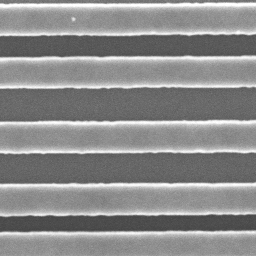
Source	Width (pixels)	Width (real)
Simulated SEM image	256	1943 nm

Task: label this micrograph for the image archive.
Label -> lines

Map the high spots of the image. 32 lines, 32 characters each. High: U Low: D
DDDDDDDDDDDDDDDDDDDDDDDDDUUUUUUU
UUUUUUUUUUUUUUUUUUUUUUUUUUUUUUUU
UUUUUUUUUUUUUUUUUUUUUUUUUUUUUUUU
UUUUUUUUUUUUUUUUUUUUUUUUUUUUUUUU
DDDDDDDDDDDDDDDDDDDDDDDDDDDDDDDD
DDDDDDDDDDDDDDDDDDDDDDDDDDDDDDDD
DDDDDDDDDDDDDDDDDDDDDDDDDDDDDDDD
UUUUUUUUUUUUUUUUUUUUUUUUUUUUUUUU
UUUUUUUUUUUUUUUUUUUUUUUUUUUUUUUU
UUUUUUUUUUUUUUUUUUUUUUUUUUUUUUUU
UUUUUUUUUUUUUUUUUUUUUUUUUUUUUUUU
DDDDDDDDDDDDDDDDDDDDDDDDDDDDDDDD
DDDDDDDDDDDDDDDDDDDDDDDDDDDDDDDD
DDDDDDDDDDDDDDDDDDDDDDDDDDDDDDDD
DDDDDDDDDDDDDDDDDDDDDDDDDDDDDDDD
UUUUUUUUUUUUUUUUUUUUUUUUUUUUUUUU
UUUUUUUUUUUUUUUUUUUUUUUUUUUUUUUU
UUUUUUUUUUUUUUUUUUUUUUUUUUUUUUUU
UUUUUUUUUUUUUUUUUUUUUUUUUUUUUUUU
DDDDDDDDDDDDDDDDDDDDDDDDDDDDDDDD
DDDDDDDDDDDDDDDDDDDDDDDDDDDDDDDD
DDDDDDDDDDDDDDDDDDDDDDDDDDDDDDDD
DDDDDDDDDDDDDDDDDDDDDDDDDDDDDDDD
UUUUUUUUUUUUUUUUUUUUUUUUUUUUUUUU
UUUUUUUUUUUUUUUUUUUUUUUUUUUUUUUU
UUUUUUUUUUUUUUUUUUUUUUUUUUUUUUUU
UUUUUUUUUUUUUUUUUUUUUUUUUUUUUUUU
DDDDDDDDDDDDDDDDDDDDDDDDDDDDDDDD
DDDDDDDDDDDDDDDDDDDDDDDDDDDDDDDD
UUUUUUUUUUUUUUUUUUUUUUUUUUUUUUUU
UUUUUUUUUUUUUUUUUUUUUUUUUUUUUUUU
UUUUUUUUUUUUUUUUUUUUUUUUUUUUUUUU